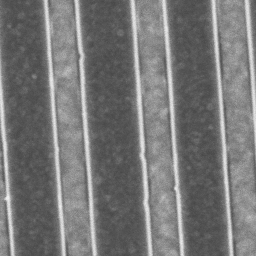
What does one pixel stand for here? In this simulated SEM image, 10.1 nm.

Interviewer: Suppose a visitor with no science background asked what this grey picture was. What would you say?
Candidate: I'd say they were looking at one or a few lines or trenches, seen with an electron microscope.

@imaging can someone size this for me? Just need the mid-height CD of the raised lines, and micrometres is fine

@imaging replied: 0.532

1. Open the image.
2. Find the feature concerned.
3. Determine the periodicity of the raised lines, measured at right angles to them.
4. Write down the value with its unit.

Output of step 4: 851 nanometres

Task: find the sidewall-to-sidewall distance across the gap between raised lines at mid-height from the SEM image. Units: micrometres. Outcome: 0.301